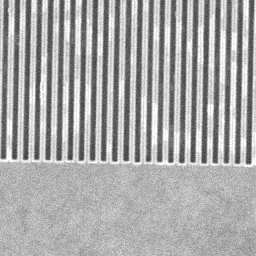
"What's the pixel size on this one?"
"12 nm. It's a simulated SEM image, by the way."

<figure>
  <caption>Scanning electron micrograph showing parallel lines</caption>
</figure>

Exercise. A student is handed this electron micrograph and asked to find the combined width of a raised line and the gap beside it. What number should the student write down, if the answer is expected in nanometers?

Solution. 134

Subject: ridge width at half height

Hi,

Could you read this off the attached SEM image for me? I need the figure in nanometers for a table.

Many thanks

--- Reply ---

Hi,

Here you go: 63.1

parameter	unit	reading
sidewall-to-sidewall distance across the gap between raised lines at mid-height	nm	73.6